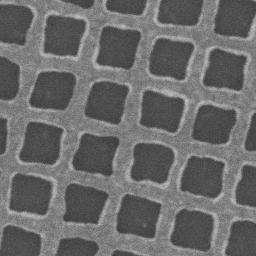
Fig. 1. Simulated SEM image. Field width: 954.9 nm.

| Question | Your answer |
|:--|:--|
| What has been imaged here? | a regular array of holes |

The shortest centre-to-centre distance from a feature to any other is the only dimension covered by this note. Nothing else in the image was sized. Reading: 53.5 px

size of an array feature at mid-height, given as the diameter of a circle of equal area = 168 nanometres